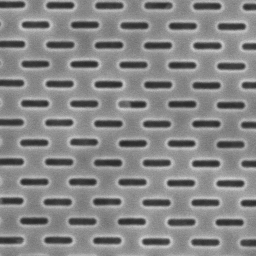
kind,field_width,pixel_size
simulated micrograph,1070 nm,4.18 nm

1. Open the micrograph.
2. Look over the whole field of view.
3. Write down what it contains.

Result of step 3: a regular array of holes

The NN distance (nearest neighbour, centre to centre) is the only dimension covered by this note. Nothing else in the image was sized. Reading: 130 nm